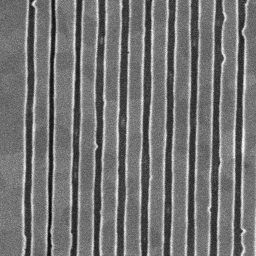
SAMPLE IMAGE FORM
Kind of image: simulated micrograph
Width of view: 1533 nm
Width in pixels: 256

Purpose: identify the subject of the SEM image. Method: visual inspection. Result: parallel lines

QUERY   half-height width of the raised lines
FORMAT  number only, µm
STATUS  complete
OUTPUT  0.0935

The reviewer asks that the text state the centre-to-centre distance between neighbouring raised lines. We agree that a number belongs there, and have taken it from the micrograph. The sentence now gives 0.14 micrometres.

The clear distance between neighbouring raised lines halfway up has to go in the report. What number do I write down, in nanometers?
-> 47.1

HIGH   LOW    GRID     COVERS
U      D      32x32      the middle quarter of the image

UUUDUUUUDDUUUUDDUUUUDDUUUDDDUUUU
UUUDUUUUDDUUUUDDUUUUDDUUUDDDUUUU
UUUDUUUUDDUUUUDDUUUUDDUUUDDDUUUU
UUUDUUUUDDUUUUDDUUUUDDUUUDDDUUUU
UUDDUUUUDDUUUUDDUUUUDDUUUDDDUUUU
UUDDUUUUDDUUUUDDUUUDDDUUUDDDUUUU
UUDDUUUUDDUUUUDDUUUDDDUUUDDDUUUD
UUDDUUUUDDUUUUDDUUUUDDUUUUDDUUUD
UUDDUUUUDDUUUUDDUUUUDDUUUUDDUUUD
UUDDUUUUDDUUUUDDUUUUDDUUUUDDUUUD
UUDDUUUUDDUUUUDDUUUUDDUUUUDUUUUD
UUDDUUUUDDUUUUDDUUUUDDUUUUDUUUUD
UUDDUUUUDDUUUDDDUUUUDDUUUDDUUUUD
UUDDUUUUDDUUUDDDUUUDDDUUUDDDUUUD
UUDDUUUUDDUUUDDDUUUDDDUUUDDDUUUD
UUDDUUUUDDUUUDDDUUUDDUUUUDDDUUUD
UUDDUUUUDDUUUDDDUUUUDUUUUDDUUUUD
UUDDUUUUDDUUUDDDUUUDDUUUUDDUUUUD
UUDDUUUUDDUUUDDDUUUDDUUUUDDUUUUD
UUDDUUUUDDUUUUDDUUUDDUUUUDDUUUUD
UUDDUUUUDDUUUDDDUUUDDUUUUDDUUUUD
UUDDUUUUDDUUUDDDUUUDDDUUUDDUUUUD
UUDDUUUUDDUUUDDDUUUDDDUUUDDUUUUD
UUDDUUUUDDUUUDDUUUUDDDUUUDDUUUUD
UUDDUUUUDDUUUDDUUUUDDDUUUDDUUUUD
UUDDUUUUDDUUUDDDUUUDDDUUUDDUUUUD
UUDDUUUUDDUUUDDDUUUDDDUUUDDUUUUD
UUDDUUUUDUUUUDDDUUUDDDUUUDDUUUUD
UUDDUUUDDUUUUDDDUUUDDUUUUDDUUUUD
UUDDUUUDDUUUUDDDUUUDDUUUUDDUUUUD
UUDDUUUDDUUUUDDDUUUDDUUUUDDUUUUD
UUDDUUUDDUUUUDDDUUUDDUUUUDDUUUUD